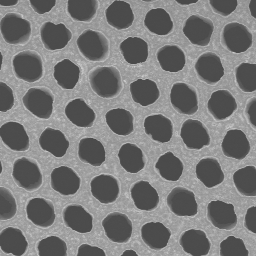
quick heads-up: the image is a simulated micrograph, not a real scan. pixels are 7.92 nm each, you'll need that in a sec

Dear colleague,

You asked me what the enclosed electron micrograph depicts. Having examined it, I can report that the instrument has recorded a regular array of holes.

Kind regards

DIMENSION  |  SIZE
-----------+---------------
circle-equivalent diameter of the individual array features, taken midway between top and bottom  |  0.217 micrometres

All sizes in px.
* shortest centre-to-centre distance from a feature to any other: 38.5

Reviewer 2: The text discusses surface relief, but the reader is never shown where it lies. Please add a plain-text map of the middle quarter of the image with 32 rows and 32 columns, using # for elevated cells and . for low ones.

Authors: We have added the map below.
...#####################......##
....####....#############....###
....###......###################
....###......###################
...####......####.....##########
...####.......###......####....#
########.....####.......###.....
########.....####.......###.....
#################......####.....
##...#############.....####.....
#.....######################....
.......#####...##############...
........###......###############
#.......##.......####.....######
##.....####......###.......###..
####..#####......###.......###..
############.....###.......##...
#############...#####......##...
######.###############.....##...
.###.....###############..####..
.###......#####..##############.
.###......####.....#############
####......####......#####..#####
#####.....####......####....####
######....####......###......###
##############......###.......##
..##############...#####......##
...#####################......##
....####....#############....###
....###......######..###########
....###......#####....##########
...####.......###......####...##